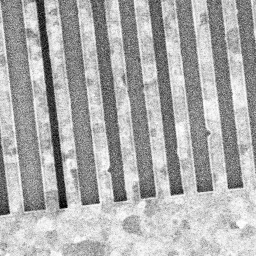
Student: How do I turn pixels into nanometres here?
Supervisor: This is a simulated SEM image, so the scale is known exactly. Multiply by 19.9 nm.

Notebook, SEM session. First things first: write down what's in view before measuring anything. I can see parallel lines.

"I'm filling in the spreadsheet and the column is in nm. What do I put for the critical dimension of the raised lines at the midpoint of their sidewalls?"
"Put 250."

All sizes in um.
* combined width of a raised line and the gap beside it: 0.571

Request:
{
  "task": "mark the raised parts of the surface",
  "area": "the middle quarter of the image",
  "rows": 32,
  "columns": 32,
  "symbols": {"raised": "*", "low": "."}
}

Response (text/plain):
.....***....***.....***...***...
.....***....***.....***...****..
.....****...***.....***....***..
.....****...***.....***....***..
*.....***....***....***....***..
*.....***....***....***....***..
*.....***....***....***....***..
*.....***....***....***....***..
*.....***....***.....***...***..
*.....***....***.....***...***..
*......***...***.....***....***.
*......***...***.....***....***.
**.....***....***....***....***.
**.....***....***....***....***.
**.....***....***....***....***.
**.....***....***....***....***.
**.....***....***....***....***.
**.....***....***.....***...***.
**.....***....***.....***....**.
**......***...***.....***....***
**......***...***.....***....***
***.....***....***....***....***
***.....***....***....***....***
***.....***....***....***....***
***.....***....***....***....***
***.....***....***.....***...***
***.....***....***.....***...***
***.....***....***.....***....**
***......***...***.....***....**
***......***...***.....***....**
****.....***....***....***....**
.***.....***....***....***....**